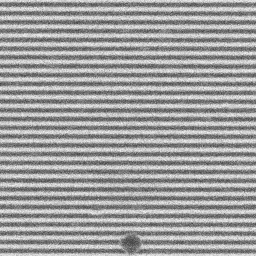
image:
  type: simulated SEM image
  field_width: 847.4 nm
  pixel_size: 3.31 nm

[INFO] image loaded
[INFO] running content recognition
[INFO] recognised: parallel lines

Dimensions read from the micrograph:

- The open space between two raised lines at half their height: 20.3 nm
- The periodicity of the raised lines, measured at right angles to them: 29.1 nanometres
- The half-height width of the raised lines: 9.1 nanometres